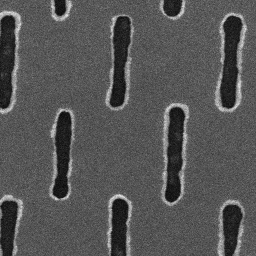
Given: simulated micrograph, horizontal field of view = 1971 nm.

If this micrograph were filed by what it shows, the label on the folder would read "holes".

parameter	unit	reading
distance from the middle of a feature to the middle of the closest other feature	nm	826